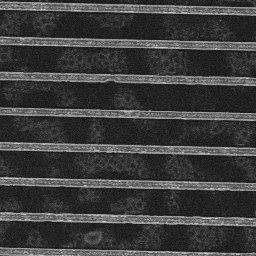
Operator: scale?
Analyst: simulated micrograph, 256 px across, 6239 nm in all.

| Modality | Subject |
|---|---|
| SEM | parallel lines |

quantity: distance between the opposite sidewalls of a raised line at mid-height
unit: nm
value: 170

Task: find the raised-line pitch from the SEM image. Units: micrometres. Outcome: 0.855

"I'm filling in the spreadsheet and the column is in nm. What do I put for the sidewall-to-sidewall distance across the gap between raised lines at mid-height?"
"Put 685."